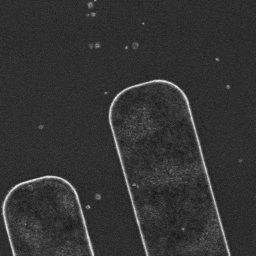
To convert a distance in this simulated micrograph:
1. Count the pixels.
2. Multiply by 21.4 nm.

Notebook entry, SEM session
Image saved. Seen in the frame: one or a few lines or trenches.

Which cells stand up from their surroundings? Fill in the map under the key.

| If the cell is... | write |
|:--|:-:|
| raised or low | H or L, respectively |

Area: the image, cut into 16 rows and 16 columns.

LLLLLLLLLLLLLLLL
LLLLLLLLLLLLLLLL
LLLLLLLLLLLLLLLL
LLLLLLLLLLLLLLLL
LLLLLLLLLLLLLLLL
LLLLLLLLHHHLLLLL
LLLLLLLHHHHHLLLL
LLLLLLLHHHHHLLLL
LLLLLLLHHHHHLLLL
LLLLLLLHHHHHHLLL
LLLLLLLLHHHHHLLL
LHHHLLLLHHHHHLLL
HHHHHLLLHHHHHLLL
HHHHHLLLLHHHHHLL
HHHHHLLLLHHHHHLL
LHHHHHLLLHHHHHLL